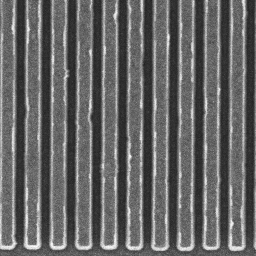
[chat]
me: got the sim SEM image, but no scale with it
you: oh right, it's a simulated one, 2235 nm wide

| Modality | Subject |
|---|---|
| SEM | parallel lines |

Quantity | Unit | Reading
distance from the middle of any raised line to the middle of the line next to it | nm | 223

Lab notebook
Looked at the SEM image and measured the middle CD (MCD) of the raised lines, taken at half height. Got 0.14 um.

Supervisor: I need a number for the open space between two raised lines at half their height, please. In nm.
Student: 89.4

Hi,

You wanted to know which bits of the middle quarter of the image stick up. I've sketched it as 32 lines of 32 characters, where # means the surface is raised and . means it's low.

#..####...###...###....###...###
#..####...###...###....###...###
#..####...###...####...###...###
#..####...###...####...###...###
#..####...###...####...###...###
#..####...###...####..####...###
#..####...###...####..####...###
#..####...###...####..####...###
#..####...###...####..####...###
#..####...###...####..####...###
#..####...###...####..####...###
#..####...###...####..####...###
#..####...###...####..####...###
#..###....###...####..####...###
#..####...###...####..####...###
#..####...###...####..####...###
#..####...###...####..####...###
#..####...###...####..####...###
#..####...###...####..####...###
#..####...###...####..####...###
#..####...###...####..####...###
#..####...###...####..####...###
...####..####...####..####...###
...####..####...####..####...###
#..####..####...####..####...###
#..####..####...####..####...###
...####..####...####..####...###
#..####..####...####..####...###
...####..####...####..####...###
...####..####...####..####...###
...####..####...####..####...###
...####..####...####..####...###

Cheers